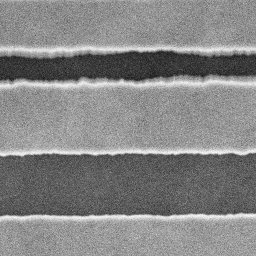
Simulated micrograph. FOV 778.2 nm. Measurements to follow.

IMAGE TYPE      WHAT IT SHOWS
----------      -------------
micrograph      lines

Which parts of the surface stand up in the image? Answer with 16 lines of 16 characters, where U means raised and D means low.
UUUUUUUUUUUUUUUU
UUUUUUUUUUUUUUUU
UUUUUUUUUUUUUUUU
DDDDDDDDDDDDDDDD
DDDDDDDDDDDDDDDD
UUUUUUUUUUUUUUUU
UUUUUUUUUUUUUUUU
UUUUUUUUUUUUUUUU
UUUUUUUUUUUUUUUU
UUUUUUUUUUUUUUUU
DDDDDDDDDDDDDDDD
DDDDDDDDDDDDDDDD
DDDDDDDDDDDDDDDD
DDUDDDDUUUDUUUUU
UUUUUUUUUUUUUUUU
UUUUUUUUUUUUUUUU